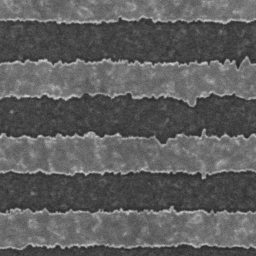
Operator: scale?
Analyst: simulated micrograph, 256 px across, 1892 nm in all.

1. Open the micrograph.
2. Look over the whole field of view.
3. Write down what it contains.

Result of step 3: one or a few lines or trenches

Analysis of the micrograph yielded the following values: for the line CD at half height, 250 nanometres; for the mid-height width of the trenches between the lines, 302 nanometres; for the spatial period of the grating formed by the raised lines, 552 nm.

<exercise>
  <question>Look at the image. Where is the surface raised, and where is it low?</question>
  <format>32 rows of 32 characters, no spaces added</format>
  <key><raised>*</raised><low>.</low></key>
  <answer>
********************************
********************************
***************....***.*.*******
................................
................................
................................
................................
.............*................*.
********************************
********************************
********************************
********************************
.......................**.......
................................
................................
................................
................................
********************.***********
********************************
********************************
********************************
..**.********.**...***.****.....
................................
................................
................................
................................
.***.*..***...***.*.**..**......
********************************
********************************
********************************
********************************
................................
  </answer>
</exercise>